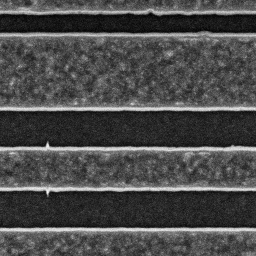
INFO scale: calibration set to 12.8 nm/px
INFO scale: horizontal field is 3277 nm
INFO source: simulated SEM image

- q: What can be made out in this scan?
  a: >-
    one or a few lines or trenches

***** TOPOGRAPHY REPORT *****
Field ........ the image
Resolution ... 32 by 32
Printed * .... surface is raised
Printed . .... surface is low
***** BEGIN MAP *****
********************************
.********..*.*****.*******.***.*
................................
................................
********************************
********************************
********************************
********************************
********************************
********************************
********************************
********************************
********************************
********************************
................................
................................
................................
................................
................................
********************************
********************************
********************************
********************************
************************.*******
................................
................................
................................
................................
................................
********************************
********************************
********************************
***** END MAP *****